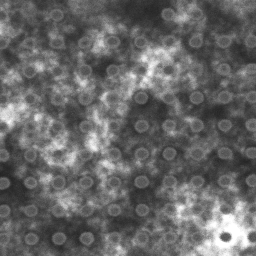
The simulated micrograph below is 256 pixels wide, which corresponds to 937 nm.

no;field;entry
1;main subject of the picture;a regular array of raised bodies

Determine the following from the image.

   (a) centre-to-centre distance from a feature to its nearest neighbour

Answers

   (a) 101 nm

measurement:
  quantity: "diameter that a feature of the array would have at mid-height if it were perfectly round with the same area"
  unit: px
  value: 11.6